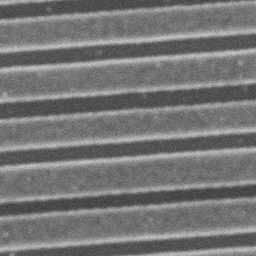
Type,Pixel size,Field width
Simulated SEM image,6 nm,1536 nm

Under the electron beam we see lines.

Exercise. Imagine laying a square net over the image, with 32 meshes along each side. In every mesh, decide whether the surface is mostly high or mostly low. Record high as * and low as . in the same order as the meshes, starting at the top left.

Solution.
...........................*****
..............******************
.*******************************
********************************
*************************.......
***********.....................
.............................***
................****************
...*****************************
********************************
******************************..
****************................
**..............................
....................************
.......*************************
********************************
*****************************...
*****************...............
**..............................
...................*************
.......*************************
********************************
********************************
************************........
***********.....................
.....................***********
........************************
********************************
********************************
***********************.........
*********.......................
.........................*******